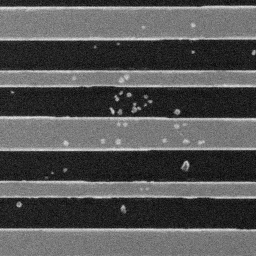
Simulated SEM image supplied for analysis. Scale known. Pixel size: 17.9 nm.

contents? lines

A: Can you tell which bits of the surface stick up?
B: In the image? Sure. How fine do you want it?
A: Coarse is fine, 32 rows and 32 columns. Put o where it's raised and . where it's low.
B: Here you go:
................................
oooooooooooooooooooooooooooooooo
oooooooooooooooooooooooooooooooo
oooooooooooooooooooooooooooooooo
oooooooooooooooooooooooooooooooo
................................
................................
................................
................................
oooooooooooooooooooooooooooooooo
oooooooooooooooooooooooooooooooo
................................
................................
................................
................................
oooooooooooooooooooooooooooooooo
oooooooooooooooooooooooooooooooo
oooooooooooooooooooooooooooooooo
oooooooooooooooooooooooooooooooo
................................
................................
................................
................................
oooooooooooooooooooooooooooooooo
oooooooooooooooooooooooooooooooo
................................
................................
................................
................................
oooooooooooooooooooooooooooooooo
oooooooooooooooooooooooooooooooo
oooooooooooooooooooooooooooooooo